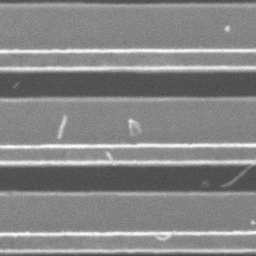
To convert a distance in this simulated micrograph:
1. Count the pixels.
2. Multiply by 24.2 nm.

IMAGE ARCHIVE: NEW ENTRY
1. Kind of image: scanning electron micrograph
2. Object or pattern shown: lines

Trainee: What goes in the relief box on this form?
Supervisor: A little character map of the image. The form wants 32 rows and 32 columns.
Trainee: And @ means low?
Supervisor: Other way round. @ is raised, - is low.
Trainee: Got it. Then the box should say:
--------------------------------
@@@@@@@@@@@@@@@@@@@@@@@@@@@@@@@@
@@@@@@@@@@@@@@@@@@@@@@@@@@@@@@@@
@@@@@@@@@@@@@@@@@@@@@@@@@@@@@@@@
@@@@@@@@@@@@@@@@@@@@@@@@@@@@@@@@
@@@@@@@@@@@@@@@@@@@@@@@@@@@@@@@@
@@@@@@@@@@@@@@@@@@@@@@@@@@@@@@@@
@@@@@@@@@@@@@@@@@@@@@@@@@@@@@@@@
@@@@@@@@@@@@@@@@@@@@@@@@@@@@@@@@
--------------------------------
--------------------------------
--------------------------------
-------------------@@@@@@@@@@@@@
@@@@@@@@@@@@@@@@@@@@@@@@@@@@@@@@
@@@@@@@@@@@@@@@@@@@@@@@@@@@@@@@@
@@@@@@@@@@@@@@@@@@@@@@@@@@@@@@@@
@@@@@@@@@@@@@@@@@@@@@@@@@@@@@@@@
@@@@@@@@@@@@@@@@@@@@@@@@@@@@@@@@
@@@@@@@@@@@@@@@@@@@@@@@@@@@@@@@@
@@@@@@@@@@@@@@@@@@@@@@@@@@@@@@@@
--------------@----------------@
--------------------------------
--------------------------------
--------------------------------
@@@@@@@@@@@@@@@@@@@@@@@@@@@@@@@@
@@@@@@@@@@@@@@@@@@@@@@@@@@@@@@@@
@@@@@@@@@@@@@@@@@@@@@@@@@@@@@@@@
@@@@@@@@@@@@@@@@@@@@@@@@@@@@@@@@
@@@@@@@@@@@@@@@@@@@@@@@@@@@@@@@@
@@@@@@@@@@@@@@@@@@@@@@@@@@@@@@@@
@@@@@@@@@@@@@@@@@@@@@@@@@@@@@@@@
@@@@@@@@@@@@@@@-@--@@@@@@@@@@@@-